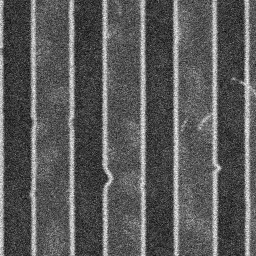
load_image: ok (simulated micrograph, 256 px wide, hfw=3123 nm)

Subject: one or a few lines or trenches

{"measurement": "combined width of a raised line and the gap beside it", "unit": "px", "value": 71.4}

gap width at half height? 0.391 µm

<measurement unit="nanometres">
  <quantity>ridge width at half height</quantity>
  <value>484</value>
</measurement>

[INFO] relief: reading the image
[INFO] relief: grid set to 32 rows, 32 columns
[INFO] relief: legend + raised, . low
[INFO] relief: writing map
....+++++....+++++....+++++....+
....+++++....+++++....+++++....+
....+++++....+++++....+++++....+
....+++++....+++++....+++++....+
....+++++....+++++....+++++....+
....+++++....+++++....+++++....+
....+++++....+++++....+++++....+
....+++++....+++++....+++++....+
....+++++....+++++....+++++....+
....+++++....+++++....+++++....+
....+++++....+++++....+++++....+
....+++++....+++++....+++++....+
....+++++....+++++....+++++....+
....+++++....+++++....+++++....+
....+++++....+++++....+++++....+
....+++++....+++++....+++++....+
....+++++....+++++....+++++....+
....+++++....+++++....+++++....+
....+++++....+++++....+++++....+
....+++++....+++++....+++++....+
....+++++....+++++....+++++....+
....+++++....+++++....+++++....+
....+++++.....++++....+++++....+
....+++++....+++++....+++++....+
....+++++....+++++....+++++....+
....+++++....+++++....+++++....+
....+++++....+++++....+++++....+
....+++++....+++++....+++++....+
....+++++....+++++....+++++....+
....+++++....+++++....+++++....+
....+++++....+++++....+++++....+
....+++++....+++++....+++++....+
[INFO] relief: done